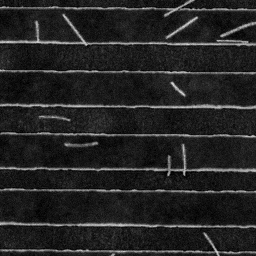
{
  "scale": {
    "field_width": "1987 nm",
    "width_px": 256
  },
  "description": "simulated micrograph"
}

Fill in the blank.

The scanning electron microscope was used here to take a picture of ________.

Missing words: lines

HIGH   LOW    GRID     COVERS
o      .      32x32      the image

................................
oooooooooooooooooooooooooooooooo
oooooooooooooooooooooooooooooooo
oooooooooooooooooooooooooooooooo
oooooooooooooooooooooooooooooooo
.....................ooooooooooo
................................
................................
................................
oooooooooooooooooooooooooooooooo
oooooooooooooooooooooooooooooooo
oooooooooooooooooooooooooooooooo
oooooooooooooooooooooooooooooooo
................................
................................
................................
................................
oooooooooooooooooooooooooooooooo
oooooooooooooooooooooooooooooooo
oooooooooooooooooooooooooooooooo
oooooooooooooooooooooooooooooooo
................................
................................
................................
oooooooooooooooooooooooooooooooo
oooooooooooooooooooooooooooooooo
oooooooooooooooooooooooooooooooo
oooooooooooooooooooooooooooooooo
................................
................................
................................
oooooooooooooooooooooooooooo....